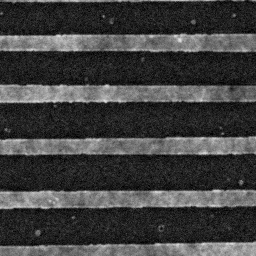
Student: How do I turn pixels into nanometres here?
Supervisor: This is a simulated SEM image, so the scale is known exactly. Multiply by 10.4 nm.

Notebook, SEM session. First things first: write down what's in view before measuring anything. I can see lines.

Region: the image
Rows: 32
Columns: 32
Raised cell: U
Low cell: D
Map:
DDDDDDDDDDDDDDDDDDDDDDDDDDDDDDDD
DDDDDDDDDDDDDDDDDDDDDDDDDDDDDDDD
DDDDDDDDDDDDDDDDDDDDDDDDDDDDDDDD
DDDDDDDDDDDDDDDDDDDDDDDDDDDDDDDD
DDDDDDDUUUUUUUUUUUUUUUUUUUUUUUUU
UUUUUUUUUUUUUUUUUUUUUUUUUUUUUUUU
DDDDDDDDDDDDDDDDDDDDDDDDDDDDDDDD
DDDDDDDDDDDDDDDDDDDDDDDDDDDDDDDD
DDDDDDDDDDDDDDDDDDDDDDDDDDDDDDDD
DDDDDDDDDDDDDDDDDDDDDDDDDDDDDDDD
DDDDDDDDDDDDDDDDDDDDDDDDDDDDDDDD
UUUUUUUUUUUUUUUUUUUUUUUUUUUUUUUU
UUUUUUUUUUUUUUUUUUUUUUUUUUUUUUUU
DDDDDDDDDDDDDDDDDDDDDDDDDDDDDDDD
DDDDDDDDDDDDDDDDDDDDDDDDDDDDDDDD
DDDDDDDDDDDDDDDDDDDDDDDDDDDDDDDD
DDDDDDDDDDDDDDDDDDDDDDDDDDDDDDDD
UUUUUUUUUUUUUUUUUUUUUUUUUUUUUUUU
UUUUUUUUUUUUUUUUUUUUUUUUUUUUUUUU
DDDDDDDDDDDDDDDDDDDDDDDDDDDDDDDD
DDDDDDDDDDDDDDDDDDDDDDDDDDDDDDDD
DDDDDDDDDDDDDDDDDDDDDDDDDDDDDDDD
DDDDDDDDDDDDDDDDDDDDDDDDDDDDDDDD
DDDDDDDDDDDDDDDDDDDDDDDDDDDDDDDD
UUUUUUUUUUUUUUUUUUUUUUUUUUUUUUUU
UUUUUUUUUUUUUUUUUUUUUUUUUUUUUUUU
DDDDDDDDDDDDDDDDDDDDDDDDDDDDDDDD
DDDDDDDDDDDDDDDDDDDDDDDDDDDDDDDD
DDDDDDDDDDDDDDDDDDDDDDDDDDDDDDDD
DDDDDDDDDDDDDDDDDDDDDDDDDDDDDDDD
DDDDDDDDDDDDDDDDDDDDDDDDUUUUUUUU
UUUUUUUUUUUUUUUUUUUUUUUUUUUUUUUU